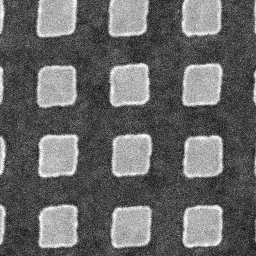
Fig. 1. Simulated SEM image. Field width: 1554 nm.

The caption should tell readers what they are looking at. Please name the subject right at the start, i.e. a regular array of raised bodies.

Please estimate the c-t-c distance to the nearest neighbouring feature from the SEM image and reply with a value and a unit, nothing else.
424 nanometres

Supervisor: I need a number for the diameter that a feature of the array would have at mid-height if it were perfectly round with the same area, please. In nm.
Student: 257